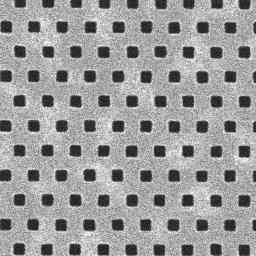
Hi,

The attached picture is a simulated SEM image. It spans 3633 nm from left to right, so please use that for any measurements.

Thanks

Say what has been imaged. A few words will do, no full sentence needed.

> a regular array of holes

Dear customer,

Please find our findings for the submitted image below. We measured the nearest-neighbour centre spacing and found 395 nm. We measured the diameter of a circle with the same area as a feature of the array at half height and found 189 nm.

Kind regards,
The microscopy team